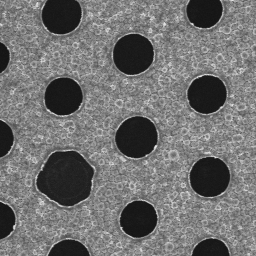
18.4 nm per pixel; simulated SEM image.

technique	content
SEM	holes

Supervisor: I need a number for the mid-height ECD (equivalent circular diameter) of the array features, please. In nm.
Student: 733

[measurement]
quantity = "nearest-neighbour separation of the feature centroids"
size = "1510 nanometers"